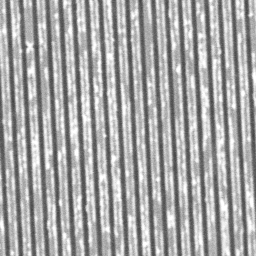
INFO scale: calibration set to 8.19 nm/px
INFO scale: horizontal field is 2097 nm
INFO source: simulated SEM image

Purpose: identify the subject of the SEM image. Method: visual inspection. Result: parallel lines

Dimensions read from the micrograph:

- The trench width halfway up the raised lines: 46 nanometers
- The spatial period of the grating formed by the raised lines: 108 nanometres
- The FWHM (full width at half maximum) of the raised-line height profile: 61.4 nm